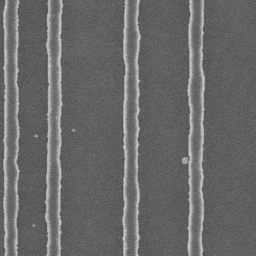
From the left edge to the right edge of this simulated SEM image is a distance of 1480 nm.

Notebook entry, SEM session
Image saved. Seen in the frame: lines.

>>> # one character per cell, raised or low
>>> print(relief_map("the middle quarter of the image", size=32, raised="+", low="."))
...............+++..............
...............+++..............
...............+++..............
...............+++..............
...............+++.............+
...............+++.............+
...............+++.............+
...............++++............+
...............+++.............+
...............+++.............+
...............+++..............
...............+++..............
...............+++..............
...............+++..............
...............+++..............
...............+++..............
...............++++.............
...............+++..............
...............+++.............+
...............+++.............+
...............+++..............
...............+++.............+
...............+++.............+
...............+++..............
...............+++.............+
...............+++.............+
...............+++.............+
...............+++..............
...............+++..............
...............+++.............+
...............+++..............
...............++++.............